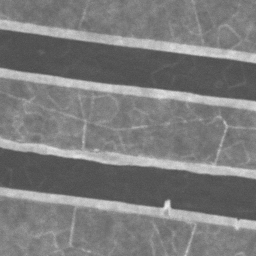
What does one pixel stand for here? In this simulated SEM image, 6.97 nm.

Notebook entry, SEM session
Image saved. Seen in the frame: one or a few lines or trenches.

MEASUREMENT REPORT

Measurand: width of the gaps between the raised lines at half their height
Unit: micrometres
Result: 0.326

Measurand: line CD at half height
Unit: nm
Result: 491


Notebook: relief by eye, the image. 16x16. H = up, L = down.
HHHHHHHHHHHHHHHH
HHHHHHHHHHHHHHHH
LLLLLLLHHHHHHHHH
LLLLLLLLLLLLLLLH
LLLLLLLLLLLLLLLL
HHHHHHHLLLLLLLLL
HHHHHHHHHHHHHHHL
HHHHHHHHHHHHHHHH
HHHHHHHHHHHHHHHH
LLLLHHHHHHHHHHHH
LLLLLLLLLLLLHHHH
LLLLLLLLLLLLLLLL
HHHHLLLLLLLLLLLL
HHHHHHHHHHHHLLLL
HHHHHHHHHHHHHHHH
HHHHHHHHHHHHHHHH